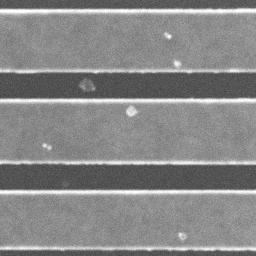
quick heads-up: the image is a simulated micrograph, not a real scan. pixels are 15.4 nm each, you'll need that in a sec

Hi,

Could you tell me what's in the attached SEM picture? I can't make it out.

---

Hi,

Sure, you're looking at lines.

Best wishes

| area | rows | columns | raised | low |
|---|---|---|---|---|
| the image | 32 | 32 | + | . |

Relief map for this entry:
................................
++++++++++++++++++++++++++++++++
++++++++++++++++++++++++++++++++
++++++++++++++++++++++++++++++++
++++++++++++++++++++++++++++++++
++++++++++++++++++++++++++++++++
++++++++++++++++++++++++++++++++
++++++++++++++++++++++++++++++++
++++++++++++++++++++++++++++++++
................................
................................
................................
++++++++++++++++++++++++++++++++
++++++++++++++++++++++++++++++++
++++++++++++++++++++++++++++++++
++++++++++++++++++++++++++++++++
++++++++++++++++++++++++++++++++
++++++++++++++++++++++++++++++++
++++++++++++++++++++++++++++++++
++++++++++++++++++++++++++++++++
................................
................................
................................
................................
++++++++++++++++++++++++++++++++
++++++++++++++++++++++++++++++++
++++++++++++++++++++++++++++++++
++++++++++++++++++++++++++++++++
++++++++++++++++++++++++++++++++
++++++++++++++++++++++++++++++++
++++++++++++++++++++++++++++++++
................................